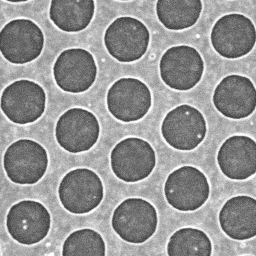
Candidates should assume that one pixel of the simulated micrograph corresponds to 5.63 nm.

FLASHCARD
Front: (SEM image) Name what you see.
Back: a regular array of holes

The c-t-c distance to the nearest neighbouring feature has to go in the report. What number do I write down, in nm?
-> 339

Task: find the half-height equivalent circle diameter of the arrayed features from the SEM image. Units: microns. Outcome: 0.256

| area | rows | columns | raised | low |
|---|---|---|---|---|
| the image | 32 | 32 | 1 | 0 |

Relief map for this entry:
11111100000011111111000001111111
11111100000011111111000001111111
11001100000111000111000001100001
00000110000110000011100111100000
00000111111110000001111111000000
00000111111110000001111111000000
00000111000111000011100001100001
10001110000011100111000001111111
11111110000011111111000000111111
11111110000011111111000001111011
10000110000011000011100001100000
00000011101110000001111111100000
00000011111110000001111111100000
00000011101110000001110011100000
10000111000011000011100001110001
11011110000011111111000000111111
11111110000011111111000000111111
11001110000011100011100001110000
10000111000111000001110011110000
00000011111111000001111111100000
00000011111111000001111111100000
10000011100011000001110001110000
10000111000001100011100000111011
11111110000001111111100000111111
11111110000001111111100000111001
11000111000011100001100001110000
10000011100111000000111111100000
10000011111111000000111111100000
10000011111111000000111011110000
10000011100001100001100000111000
11101111000001111111100000111111
11111111000001111111100000111111